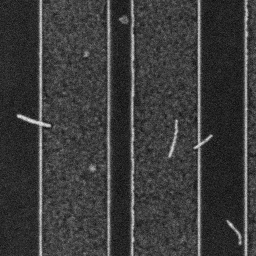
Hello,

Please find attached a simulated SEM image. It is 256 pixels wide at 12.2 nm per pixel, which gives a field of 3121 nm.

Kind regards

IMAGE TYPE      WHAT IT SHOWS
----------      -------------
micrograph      lines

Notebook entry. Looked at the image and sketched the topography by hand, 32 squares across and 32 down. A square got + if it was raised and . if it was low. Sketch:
+++++.........+++........++++++.
+++++.........+++........++++++.
+++++.........+++........++++++.
+++++.........+++........++++++.
+++++.........+++........++++++.
+++++.........+++........++++++.
+++++.........+++........++++++.
+++++.........+++........++++++.
+++++.........+++........++++++.
+++++.........+++........++++++.
+++++.........+++........++++++.
+++++.........+++........++++++.
+++++.........+++........++++++.
+++++.........+++........++++++.
+++++.........+++........++++++.
+++++.........+++........++++++.
+++++.........+++........++++++.
+++++.........+++........++++++.
+++++.........+++........++++++.
+++++.........+++........++++++.
+++++.........+++........++++++.
+++++.........+++........++++++.
+++++.........+++........++++++.
+++++.........+++........++++++.
+++++.........+++........++++++.
+++++.........+++........++++++.
+++++.........+++........++++++.
+++++.........+++........++++++.
+++++.........+++........++++++.
+++++.........+++........++++++.
+++++.........+++........++++++.
+++++.........+++........++++++.